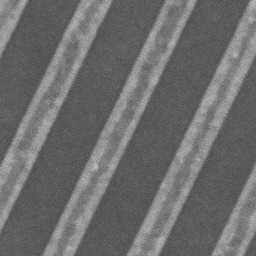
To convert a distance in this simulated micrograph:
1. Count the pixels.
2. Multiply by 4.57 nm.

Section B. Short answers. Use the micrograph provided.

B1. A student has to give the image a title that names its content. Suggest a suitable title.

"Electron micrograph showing one or a few lines or trenches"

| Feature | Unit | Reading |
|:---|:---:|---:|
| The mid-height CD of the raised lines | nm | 101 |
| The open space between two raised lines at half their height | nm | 246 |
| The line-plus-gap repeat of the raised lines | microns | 0.349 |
